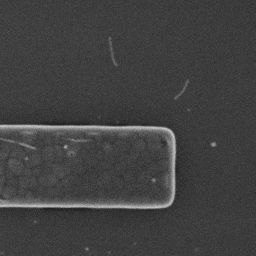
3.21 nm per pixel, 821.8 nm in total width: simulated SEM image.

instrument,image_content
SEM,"wiring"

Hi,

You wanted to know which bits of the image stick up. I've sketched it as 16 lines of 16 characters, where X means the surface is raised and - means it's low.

----------------
----------------
----------------
----------------
----------------
----------------
----------------
----------------
XXXXXXXXXXX-----
XXXXXXXXXXX-----
XXXXXXXXXXX-----
XXXXXXXXXXX-----
XXXXXXXXXXX-----
----------------
----------------
----------------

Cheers